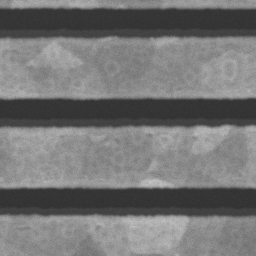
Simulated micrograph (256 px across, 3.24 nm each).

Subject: lines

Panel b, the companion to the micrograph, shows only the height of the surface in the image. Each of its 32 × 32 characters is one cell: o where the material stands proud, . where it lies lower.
oooooooooooooooooooooooooooooooo
................................
................................
................................
................................
oooooooooooooooooooooooooooooooo
oooooooooooooooooooooooooooooooo
oooooooooooooooooooooooooooooooo
oooooooooooooooooooooooooooooooo
oooooooooooooooooooooooooooooooo
oooooooooooooooooooooooooooooooo
oooooooooooooooooooooooooooooooo
................................
................................
................................
................................
oooooooooooooooooooooooooooooooo
oooooooooooooooooooooooooooooooo
oooooooooooooooooooooooooooooooo
oooooooooooooooooooooooooooooooo
oooooooooooooooooooooooooooooooo
oooooooooooooooooooooooooooooooo
oooooooooooooooooooooooooooooooo
oooooo.o.ooooooo..o.ooooooo.o.oo
................................
................................
................................
oooooooooooooooooooooooooooooooo
oooooooooooooooooooooooooooooooo
oooooooooooooooooooooooooooooooo
oooooooooooooooooooooooooooooooo
oooooooooooooooooooooooooooooooo